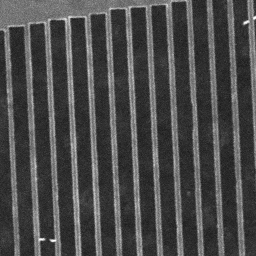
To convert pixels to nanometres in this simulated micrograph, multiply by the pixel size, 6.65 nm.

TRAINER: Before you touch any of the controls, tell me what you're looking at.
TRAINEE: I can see parallel lines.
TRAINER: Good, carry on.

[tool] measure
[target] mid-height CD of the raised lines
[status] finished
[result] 30.7 nm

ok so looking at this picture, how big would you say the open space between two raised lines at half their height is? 0.105 µm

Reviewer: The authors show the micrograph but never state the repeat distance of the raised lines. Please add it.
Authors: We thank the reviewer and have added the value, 0.136 microns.